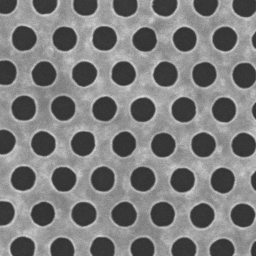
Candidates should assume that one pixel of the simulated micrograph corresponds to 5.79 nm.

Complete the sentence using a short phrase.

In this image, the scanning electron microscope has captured a regular array of holes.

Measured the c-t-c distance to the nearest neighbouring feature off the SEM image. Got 229 nanometers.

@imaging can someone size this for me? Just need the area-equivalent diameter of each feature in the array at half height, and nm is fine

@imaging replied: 146